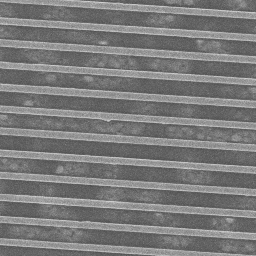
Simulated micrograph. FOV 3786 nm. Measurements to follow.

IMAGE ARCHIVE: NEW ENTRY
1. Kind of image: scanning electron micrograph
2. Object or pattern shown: parallel lines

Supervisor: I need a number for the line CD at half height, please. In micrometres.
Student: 0.103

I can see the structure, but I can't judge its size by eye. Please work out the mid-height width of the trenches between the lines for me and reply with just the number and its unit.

230 nm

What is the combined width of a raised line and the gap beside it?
0.326 µm